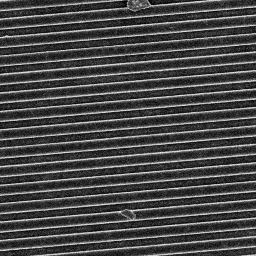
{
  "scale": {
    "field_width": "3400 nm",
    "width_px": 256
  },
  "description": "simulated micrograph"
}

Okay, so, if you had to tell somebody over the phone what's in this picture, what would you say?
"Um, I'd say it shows parallel lines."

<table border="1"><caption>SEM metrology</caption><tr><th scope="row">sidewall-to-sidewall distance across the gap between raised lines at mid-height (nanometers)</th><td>99.1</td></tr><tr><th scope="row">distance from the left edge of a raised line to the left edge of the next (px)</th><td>18.4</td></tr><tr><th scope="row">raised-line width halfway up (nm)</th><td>142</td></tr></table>